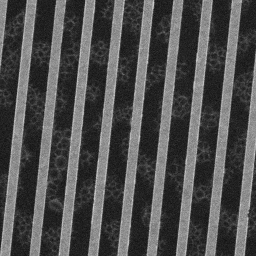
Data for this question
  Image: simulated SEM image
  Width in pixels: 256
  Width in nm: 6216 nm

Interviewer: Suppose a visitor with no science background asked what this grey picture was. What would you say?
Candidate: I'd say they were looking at parallel lines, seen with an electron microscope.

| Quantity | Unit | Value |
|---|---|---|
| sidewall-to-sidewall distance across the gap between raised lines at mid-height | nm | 480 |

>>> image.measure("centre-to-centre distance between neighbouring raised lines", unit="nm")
707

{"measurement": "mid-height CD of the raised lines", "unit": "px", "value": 9.2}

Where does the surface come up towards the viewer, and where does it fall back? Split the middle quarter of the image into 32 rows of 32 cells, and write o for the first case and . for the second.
....oo.....oo......oo.....oo....
....oo.....oo.....ooo.....oo....
....oo.....oo.....oo......oo....
...ooo.....oo.....oo.....ooo....
...ooo.....oo.....oo.....ooo....
...oo......oo.....oo.....oo.....
...oo......oo.....oo.....oo.....
...oo.....ooo.....oo.....oo.....
...oo.....oo......oo.....oo.....
...oo.....oo......oo.....oo.....
...oo.....oo.....ooo.....oo.....
...oo.....oo.....ooo.....oo.....
..ooo.....oo.....oo......oo.....
..ooo.....oo.....oo.....ooo.....
..ooo.....oo.....oo.....oo......
..oo......oo.....oo.....oo......
..oo.....ooo.....oo.....oo.....o
..oo.....oo......oo.....oo.....o
..oo.....oo......oo.....oo.....o
..oo.....oo......oo.....oo.....o
..oo.....oo.....ooo.....oo.....o
..oo.....oo.....oo......oo.....o
oooo.....oo.....oo......oo.....o
.ooo.....oo.....oo.....ooo.....o
.oo......oo.....oo.....oo......o
.oo......oo.....oo.o...oo.....oo
.oo.....ooo.....oo.o...oo..o..oo
.oo.....oo......oo.....oo.....oo
.oo.....oo......oo.....oo.....oo
.oo.....oo.....ooo.....oo.....oo
.oo.....oo.....ooo.....oo.....oo
.oo.....oo.....oo......oo.....oo